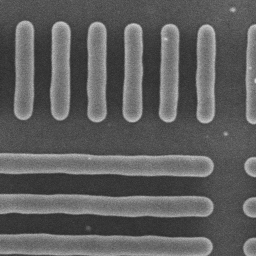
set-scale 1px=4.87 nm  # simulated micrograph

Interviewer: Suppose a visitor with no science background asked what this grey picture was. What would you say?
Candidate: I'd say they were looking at groups of lines, slits or small figures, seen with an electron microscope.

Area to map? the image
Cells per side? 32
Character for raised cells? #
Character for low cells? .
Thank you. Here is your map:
................................
................................
................................
..##...##..##...##..##...##....#
..##...##..##...##..##...##....#
..##...##..##...##..##...##....#
..##...##..##...##..##...##....#
..##...##..##...##..##...##....#
..##...##..##...##..##...##....#
..##...##..##...##..##...##....#
..##..###..##...##..##...##....#
..##..###..##..###..##...##....#
..##..###..##..###..##...##....#
..##..###..##..###..##...##....#
..##...#...##...##..##...##....#
................................
................................
................................
................................
############........###.........
###########################....#
##########################.....#
................................
................................
############....................
###########################....#
##########################.....#
................................
................................
#############...................
##########################.....#
##########################.....#